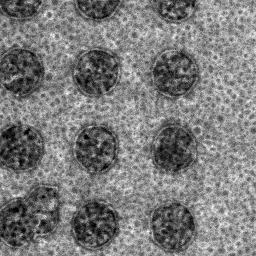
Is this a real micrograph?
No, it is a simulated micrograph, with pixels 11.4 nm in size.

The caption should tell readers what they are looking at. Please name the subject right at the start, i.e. raised bodies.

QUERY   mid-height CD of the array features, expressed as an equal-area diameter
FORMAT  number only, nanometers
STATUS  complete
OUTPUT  518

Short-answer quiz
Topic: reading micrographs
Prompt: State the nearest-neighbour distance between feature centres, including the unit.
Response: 0.866 microns